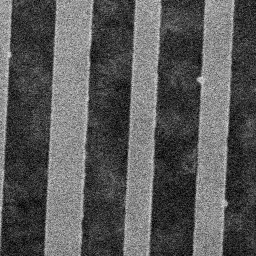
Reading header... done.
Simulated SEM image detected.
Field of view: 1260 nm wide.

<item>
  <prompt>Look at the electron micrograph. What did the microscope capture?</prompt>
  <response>one or a few lines or trenches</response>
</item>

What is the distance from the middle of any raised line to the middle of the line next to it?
72.4 pixels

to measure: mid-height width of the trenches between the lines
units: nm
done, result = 219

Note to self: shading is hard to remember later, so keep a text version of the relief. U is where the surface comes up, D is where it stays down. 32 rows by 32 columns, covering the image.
UDDDDDDUUUUUDDDDDUUUDDDDDDUUUDDD
UDDDDDDUUUUDDDDDDUUUDDDDDDUUUDDD
UDDDDDDUUUUDDDDDDUUUDDDDDDUUUDDD
UDDDDDDUUUUDDDDDDUUUDDDDDDUUUDDD
UDDDDDDUUUUDDDDDDUUUDDDDDDUUUDDD
UDDDDDDUUUUDDDDDDUUUDDDDDUUUUDDD
UDDDDDDUUUUDDDDDDUUUDDDDDUUUUDDD
UDDDDDDUUUUDDDDDDUUUDDDDDUUUUDDD
UDDDDDDUUUUDDUDDDUUUDDDDDUUUUDDD
UDDDDDDUUUUDDDDDDUUUDDUDDUUUUDDD
UDDDDDDUUUUDDDDDDUUUDDUDDUUUUDDD
UDDDDDDUUUUDDDDDUUUDDDDDDUUUUDDD
UDDDDDDUUUUDDDDDUUUDDDDDDUUUUDDD
UDDDDDDUUUUDDDDDUUUDDDDDDUUUUDDD
UDDDDDDUUUUDDDDDUUUDDDDDDUUUDDDD
UDDDDDUUUUUDDDDDUUUDDDDDDUUUDDDD
UDDDDDUUUUUDDDDDUUUDDDDDDUUUDDDD
UDDDDUUUUUUDDDDDUUUDDDDDDUUUDDDD
DDDDDDUUUUDDDDDDUUUDDDDDDUUUDDDD
UDDDDDUUUUUDDDDDUUUDDDDUUUUUDDDD
DDDDDDUUUUDDDDDDUUUDDDDUUUUUDDDD
DDDDDDUUUUUDDDDDUUUDDDDDDUUUDDDD
DDDDDDUUUUDDDDDDUUUDDDDDDUUUDDDD
DDDDDDUUUUDDDDDDUUUDDDDDDUUUDDDD
DDDDDDUUUUDDDDDDUUUDDDDDDUUUDDDD
DDDDDDUUUUDDDDDDUUUDDDDDUUUUDDDD
DDDDDDUUUUDDDDDDUUUDDDDDUUUUDDDD
DDDDDDUUUUDDDDDDUUUDDDDDUUUUDDDD
DDDDDDUUUUDDDDDDUUUDDDDDUUUUDDDD
DDDDDDUUUUDDDDDDUUUDDDDDUUUUDDDD
DDDDDDUUUUDDDDDDUUUDDDDDUUUUDDDD
DDDDDDUUUUDDDDDDUUUDDDDDUUUUDDDD